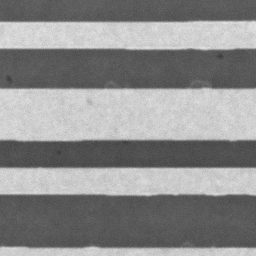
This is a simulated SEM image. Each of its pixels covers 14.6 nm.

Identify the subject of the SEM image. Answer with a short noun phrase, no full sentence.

lines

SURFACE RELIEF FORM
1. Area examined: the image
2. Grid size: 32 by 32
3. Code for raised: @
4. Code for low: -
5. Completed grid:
--------------------------------
--------------------------------
--------------------------------
@@@@@@@@@@@@@@@@@@@@@@@@@@@@@@@@
@@@@@@@@@@@@@@@@@@@@@@@@@@@@@@@@
@@@@@@@@@@@@@@@@@@@@@@@@@@@@@@@@
--------------------------------
--------------------------------
--------------------------------
--------------------------------
--------------------------------
@@@@@@@@@@@@@@@@@@@@@@@@@@@@@@@@
@@@@@@@@@@@@@@@@@@@@@@@@@@@@@@@@
@@@@@@@@@@@@@@@@@@@@@@@@@@@@@@@@
@@@@@@@@@@@@@@@@@@@@@@@@@@@@@@@@
@@@@@@@@@@@@@@@@@@@@@@@@@@@@@@@@
@@@@@@@@@@@@@@@@@@@@@@@@@@@@@@@@
--@@@@@@@-----------------------
--------------------------------
--------------------------------
--------------------------------
@@@@@@@@@@@@@@@@@@@@@@@@@@@@@@@@
@@@@@@@@@@@@@@@@@@@@@@@@@@@@@@@@
@@@@@@@@@@@@@@@@@@@@@@@@@@@@@@@@
--------------------------------
--------------------------------
--------------------------------
--------------------------------
--------------------------------
--------------------------------
--------------------------------
@@@@@@@@@@@@@@@@@@@@@@@@@@@@@@@@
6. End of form